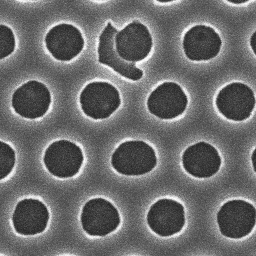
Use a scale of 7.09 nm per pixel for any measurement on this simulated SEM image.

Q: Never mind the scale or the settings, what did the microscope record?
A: a regular array of holes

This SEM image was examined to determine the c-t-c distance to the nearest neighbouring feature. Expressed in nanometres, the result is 471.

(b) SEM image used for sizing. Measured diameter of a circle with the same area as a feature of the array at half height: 277 nanometers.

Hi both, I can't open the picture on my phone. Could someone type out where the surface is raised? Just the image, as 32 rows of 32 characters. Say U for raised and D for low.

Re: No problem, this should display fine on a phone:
UUUUUUUUUUUUUUUUUUUUUUUUUUUUUDUU
UUUUUUUUUUUUUUUUUUUUUUUUUUUUUUUU
UUUUUUUUUUUUUUUUUUUUUUUUUUUUUUUU
DUUUUUDDDDUUUDDDDDUUUUUUDDUUUUUU
DDUUUUDDDDUUUDDDDDDUUUUDDDDUUUUD
DDUUUUDDDDUUDDDDDDDUUUUDDDDDUUUD
DDUUUUDDDDUUDDDDDDDUUUUDDDDUUUUU
UUUUUUUDDUUUDDDDDDUUUUUUDDUUUUUU
UUUUUUUUUUUUUUDDDUUUUUUUUUUUUUUU
UUUUUUUUUUUUUUUDDDUUUUUUUUUUUUUU
UUUDDUUUUUUDDDUUUUUUDDUUUUUUUDDU
UUDDDDUUUUDDDDDUUUUDDDDUUUUDDDDD
UUDDDDUUUUDDDDDUUUDDDDDUUUUDDDDD
UUDDDDUUUUDDDDDUUUDDDDDUUUUDDDDD
UUUDDUUUUUUDDDUUUUUUDDUUUUUUDDDU
UUUUUUUUUUUUUUUUUUUUUUUUUUUUUUUU
UUUUUUUUUUUUUUUUUUUUUUUUUUUUUUUU
UUUUUUUUUUUUUUUUUUUUUUUUUUUUUUUU
DDUUUUDDDDUUUUUDDDDUUUUDDDDUUUUU
DDUUUDDDDDUUUUDDDDDDUUUDDDDUUUUD
DDUUUUDDDDUUUUDDDDDDUUUDDDDDUUUD
DUUUUUDDDDUUUUUDDDDUUUUDDDDUUUUU
UUUUUUUUUUUUUUUUUUUUUUUUUUUUUUUU
UUUUUUUUUUUUUUUUUUUUUUUUUUUUUUUU
UUUUUUUUUUUUUUUUUUUUUUUUUUUUUUUU
UUDDDDUUUUUDDDUUUUUDDDDUUUUUDDDD
UUDDDDUUUUDDDDDUUUDDDDDUUUUDDDDD
UDDDDDUUUUDDDDDUUUDDDDDUUUUDDDDD
UUDDDDUUUUDDDDDUUUUDDDDUUUUDDDDD
UUUUUUUUUUUUDUUUUUUUDDUUUUUUDDDU
UUUUUUUUUUUUUUUUUUUUUUUUUUUUUUUU
UUUUUUUUUUUUUUUUUUUUUUUUUUUUUUUU